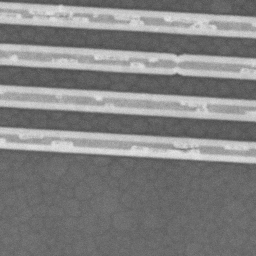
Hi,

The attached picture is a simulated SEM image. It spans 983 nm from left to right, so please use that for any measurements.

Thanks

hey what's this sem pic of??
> parallel lines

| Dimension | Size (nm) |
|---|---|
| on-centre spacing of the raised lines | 160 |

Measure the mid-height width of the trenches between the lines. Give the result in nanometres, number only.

104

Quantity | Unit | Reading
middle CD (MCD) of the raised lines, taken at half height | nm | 55.1